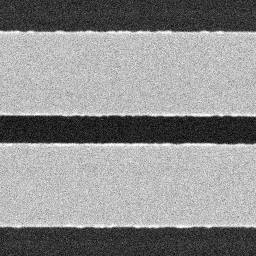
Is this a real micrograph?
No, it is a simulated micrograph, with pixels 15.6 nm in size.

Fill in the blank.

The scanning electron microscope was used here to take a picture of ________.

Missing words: lines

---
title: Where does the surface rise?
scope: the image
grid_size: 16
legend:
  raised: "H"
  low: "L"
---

LLLLLLLLLLLLLLLL
LLLLLLLLLLLLLLLL
HHHHHHHHHHHHHHHH
HHHHHHHHHHHHHHHH
HHHHHHHHHHHHHHHH
HHHHHHHHHHHHHHHH
HHHHHHHHHHHHHHHH
LLLLLLLLLLLLLLLL
LLLLLLLLLLLLLLLL
HHHHHHHHHHHHHHHH
HHHHHHHHHHHHHHHH
HHHHHHHHHHHHHHHH
HHHHHHHHHHHHHHHH
HHHHHHHHHHHHHHHH
LLLLLLLLLLLLLLLL
LLLLLLLLLLLLLLLL